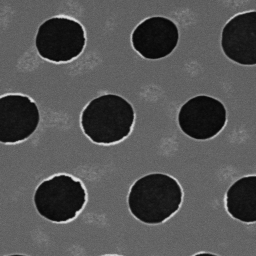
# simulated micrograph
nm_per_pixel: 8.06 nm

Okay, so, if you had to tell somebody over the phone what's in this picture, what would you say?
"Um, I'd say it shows holes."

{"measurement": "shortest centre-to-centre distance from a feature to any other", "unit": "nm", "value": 744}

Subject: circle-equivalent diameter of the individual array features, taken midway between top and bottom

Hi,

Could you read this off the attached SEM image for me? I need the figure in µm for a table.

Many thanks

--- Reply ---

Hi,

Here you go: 0.378